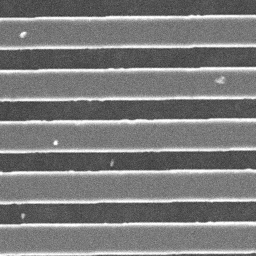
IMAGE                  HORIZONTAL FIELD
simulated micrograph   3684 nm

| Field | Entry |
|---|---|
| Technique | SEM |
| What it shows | lines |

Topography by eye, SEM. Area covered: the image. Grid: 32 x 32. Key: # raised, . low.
................................
................................
################################
################################
################################
################################
................................
................................
.........................#######
################################
################################
################################
########........................
................................
................................
################################
################################
################################
################################
................................
................................
............####################
################################
################################
################################
................................
................................
................................
################################
################################
################################
################################